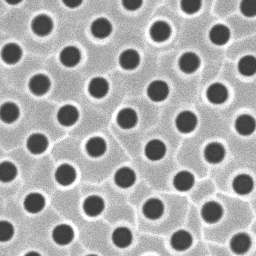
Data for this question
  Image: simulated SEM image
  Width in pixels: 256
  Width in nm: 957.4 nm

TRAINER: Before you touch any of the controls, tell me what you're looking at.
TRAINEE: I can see a regular array of holes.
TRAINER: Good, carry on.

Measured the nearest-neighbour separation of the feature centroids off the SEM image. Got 156 nm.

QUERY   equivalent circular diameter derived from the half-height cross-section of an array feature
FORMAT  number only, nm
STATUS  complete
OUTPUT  78.5